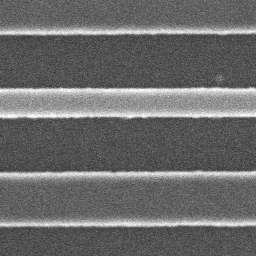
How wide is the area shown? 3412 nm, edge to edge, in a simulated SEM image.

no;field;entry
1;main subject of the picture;lines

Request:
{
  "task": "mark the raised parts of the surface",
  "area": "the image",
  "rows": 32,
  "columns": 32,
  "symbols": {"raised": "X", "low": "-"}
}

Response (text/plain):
XXXXXXXXXXXXXXXXXXXXXXXXXXXXXXXX
XXXXXXXXXXXXXXXXXXXXXXXXXXXXXXXX
XXXXXXXXXXXXXXXXXXXXXXXXXXXXXXXX
XXXXXXXXXXXXXXXXXXXXXXXXXXXXXXXX
--------------------------------
--------------------------------
--------------------------------
--------------------------------
--------------------------------
--------------------------------
--------------------------------
XXXXXXXXXXXXXXXXXXXXXXXXXXXXXXXX
XXXXXXXXXXXXXXXXXXXXXXXXXXXXXXXX
XXXXXXXXXXXXXXXXXXXXXXXXXXXXXXXX
XXXXXXXXXXXXXXXXXXXXXXXXXXXXXXXX
--------------------------------
--------------------------------
--------------------------------
--------------------------------
--------------------------------
--------------------------------
------------------------X-------
XXXXXXXXXXXXXXXXXXXXXXXXXXXXXXXX
XXXXXXXXXXXXXXXXXXXXXXXXXXXXXXXX
XXXXXXXXXXXXXXXXXXXXXXXXXXXXXXXX
XXXXXXXXXXXXXXXXXXXXXXXXXXXXXXXX
XXXXXXXXXXXXXXXXXXXXXXXXXXXXXXXX
XXXXXXXXXXXXXXXXXXXXXXXXXXXXXXXX
--------------------------------
--------------------------------
--------------------------------
--------------------------------